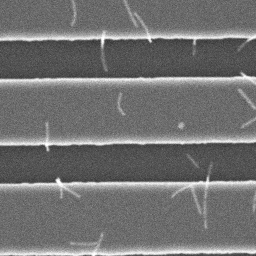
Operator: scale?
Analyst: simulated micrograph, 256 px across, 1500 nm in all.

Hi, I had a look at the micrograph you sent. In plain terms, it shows lines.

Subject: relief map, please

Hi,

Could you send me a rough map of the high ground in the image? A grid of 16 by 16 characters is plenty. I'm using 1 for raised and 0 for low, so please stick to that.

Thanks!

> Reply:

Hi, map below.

1111111111111111
1111111111111111
1110100000000000
0000000000000000
0000000000000000
1111111111111111
1111111111111111
1111111111111111
1111111111111111
0000000000000000
0000000000000000
0111111111111111
1111111111111111
1111111111111111
1111111111111111
1111111111111111